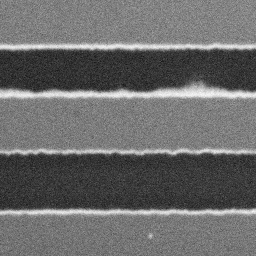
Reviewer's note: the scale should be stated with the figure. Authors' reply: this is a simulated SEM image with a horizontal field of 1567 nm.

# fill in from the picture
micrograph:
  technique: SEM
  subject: lines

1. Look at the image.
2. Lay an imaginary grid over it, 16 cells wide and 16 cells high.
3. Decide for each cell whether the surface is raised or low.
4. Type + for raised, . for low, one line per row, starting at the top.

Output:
++++++++++++++++
++++++++++++++++
++++++++++++++++
................
................
................
++++++++++++++++
++++++++++++++++
++++++++++++++++
++++++++++++++++
................
................
................
++++++++++++++++
++++++++++++++++
++++++++++++++++